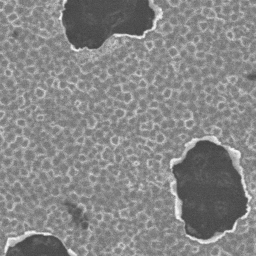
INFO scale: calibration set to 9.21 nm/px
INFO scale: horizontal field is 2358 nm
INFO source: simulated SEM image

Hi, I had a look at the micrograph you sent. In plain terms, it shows holes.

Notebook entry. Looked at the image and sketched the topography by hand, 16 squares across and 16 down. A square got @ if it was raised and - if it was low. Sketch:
@@@@------@@@@@@
@@@@------@@@@@@
@@@@---@@@@@@@@@
@@@@@@@@@@@@@@@@
@@@@@@@@@@@@@@@@
@@@@@@@@@@@@@@@@
@@@@@@@@@@@@@@@@
@@@@@@@@@@@@@@@@
@@@@@@@@@@@@@@@@
@@@@@@@@@@@@--@@
@@@@@@@@@@@----@
@@@@@@@@@@@----@
@@@@@@@@@@@----@
@@@@@@@@@@@----@
@@@@@@@@@@@@--@@
@---@@@@@@@@@@@@